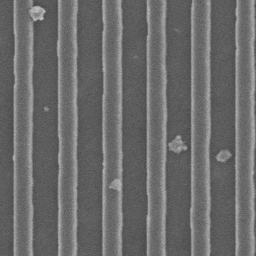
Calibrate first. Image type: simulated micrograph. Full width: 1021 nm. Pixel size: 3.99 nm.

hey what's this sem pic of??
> lines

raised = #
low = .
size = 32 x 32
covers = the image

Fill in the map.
..##...###...##...###...##....##
..###..###...##...###...##....##
..##...##....##...###...##....##
..##...##....##....##...##....##
..##...##....##...###...##....##
..##...##....##...###...##....##
..##...###...##...###...##....##
..##...##....##...###...##....##
..##...##....##...###...##....##
..##...##....##...###...##....##
..##...##....##...###...##....##
..##...##....##...###...##....##
..##...##....##...###...##....##
..##...##....##...###...##....##
..##...###...##...###...##....##
..##...###...##...###...##....##
..##...###...##...###...##....##
..##...##....##...###...##....##
..##...##....##...###...##....##
..##...##....##...###...##.##.##
..##...##....##...###...##...###
..##...###...##...###...##....##
..##...##....##...###...##....#.
..##...##....##...###...##....##
..##...##....##...###...##....##
..##...##....##....##...##....##
..##...##....##....##...##....##
..##...##....##...###...##....##
..##...##....##...###...##....##
..##...##....##...###...##....##
..##...##....##...###...##....##
..##...##....##...###...##....##